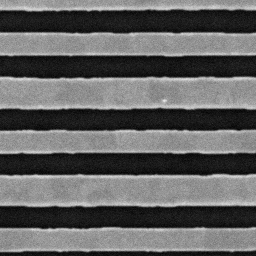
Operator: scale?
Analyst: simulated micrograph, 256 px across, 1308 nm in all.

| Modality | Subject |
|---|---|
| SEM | lines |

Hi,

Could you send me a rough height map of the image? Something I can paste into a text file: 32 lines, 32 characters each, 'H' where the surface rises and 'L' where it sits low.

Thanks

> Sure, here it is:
HHHHHHHHHHHHHHHHHHHHHHHHHHHHHHHH
LLLLLLLLLLLLLLLLLLLLLLLLLLLLLLLL
LLLLLLLLLLLLLLLLLLLLLLLLLLLLLLLL
LLLLLLLLLLLLLLLLLLLLLLLLLLLLLLLL
HHHHHHHHHHHHHHHHHHHHHHHHHHHHHHHH
HHHHHHHHHHHHHHHHHHHHHHHHHHHHHHHH
HHHHHHHHHHHHHHHHHHHHHHHHHHHHHHHH
LLLLLLLLLLLLLLLLLLLLLLLLLLLLLLLL
LLLLLLLLLLLLLLLLLLLLLLLLLLLLLLLL
LLLLLLLLLLLLLLLLLLLLLLLLLLLLLLLL
HHHHHHHHHHHHHHHHHHHHHHHHHHHHHHHH
HHHHHHHHHHHHHHHHHHHHHHHHHHHHHHHH
HHHHHHHHHHHHHHHHHHHHHHHHHHHHHHHH
HLHHHHHHLLLLHHHHHLLLLLLHLLLLLLLH
LLLLLLLLLLLLLLLLLLLLLLLLLLLLLLLL
LLLLLLLLLLLLLLLLLLLLLLLLLLLLLLLL
HHHHHHHHHHHHHHHHHHHHHHHHHHHHHHHH
HHHHHHHHHHHHHHHHHHHHHHHHHHHHHHHH
HHHHHHHHHHHHHHHHHHHHHHHHHHHHHHHH
LLLLLLLLLLLLLLLLLLLLLLLLLLLLLLLL
LLLLLLLLLLLLLLLLLLLLLLLLLLLLLLLL
LLLLLLLLLLLLLLLLLLLLLLLLLLLLLLLL
HHHHHHHHHHHHHHHHHHHHHHHHHHHHHHHH
HHHHHHHHHHHHHHHHHHHHHHHHHHHHHHHH
HHHHHHHHHHHHHHHHHHHHHHHHHHHHHHHH
HHHHHHHHHHHHHHHHHHHHHHHHHHHHHHHH
LLLLLLLLLLLLLLLLLLLLLLLLLLLLLLLL
LLLLLLLLLLLLLLLLLLLLLLLLLLLLLLLL
LLLLLLLLLLLLHHHHLLLLLLLLHHLLLLLH
HHHHHHHHHHHHHHHHHHHHHHHHHHHHHHHH
HHHHHHHHHHHHHHHHHHHHHHHHHHHHHHHH
LLLLLLLLLLLLLLLLLLLLLLLLLLLLLLLL